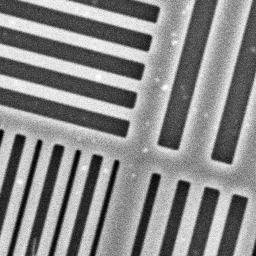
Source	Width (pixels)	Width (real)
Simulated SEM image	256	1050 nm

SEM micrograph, groups of lines, slits or small figures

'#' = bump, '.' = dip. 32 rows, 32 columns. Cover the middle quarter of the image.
#####...............########....
########............########....
.############.......########....
.....###########....########....
........###################.....
.............##############.....
................###########.....
##................#########.....
#######...........########......
##########........########......
..############....########......
......####################.....#
..........###############......#
.............############......#
................#########......#
####............########......##
#######.........########......##
############....########......##
########################.....###
#######################......###
########################.....###
###.############################
###.############################
##..###...######################
##..###...###.##################
##..##...###..##################
##.###...###..##################
#..###...###.#########..########
#..###...##..#########..########
#.###...###..########...#####..#
#.###...###.#########...####....
..###...###.#########..#####...#